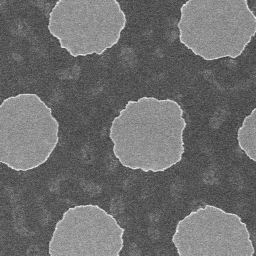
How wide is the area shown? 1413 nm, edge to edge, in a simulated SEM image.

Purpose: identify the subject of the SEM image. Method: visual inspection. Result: raised bodies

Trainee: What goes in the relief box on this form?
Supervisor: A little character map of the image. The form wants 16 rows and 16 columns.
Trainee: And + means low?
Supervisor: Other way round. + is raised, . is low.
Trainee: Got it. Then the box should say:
...+++++...+++++
...+++++...+++++
....+++....+++++
.............++.
................
................
+++.....+++.....
+++....++++....+
++++...++++....+
+++....++++....+
.+......++......
................
................
....+++.....+++.
...+++++...++++.
...+++++...+++++